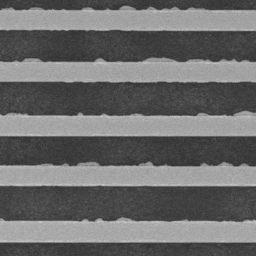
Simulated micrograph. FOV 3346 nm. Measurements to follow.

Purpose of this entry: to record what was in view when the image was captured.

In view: lines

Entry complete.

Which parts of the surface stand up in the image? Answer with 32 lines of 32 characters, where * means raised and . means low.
................................
********************************
********************************
********************************
................................
................................
................................
................................
********************************
********************************
................................
................................
................................
................................
................................
********************************
********************************
................................
................................
................................
................................
********************************
********************************
................................
................................
................................
................................
................................
********************************
********************************
................................
................................